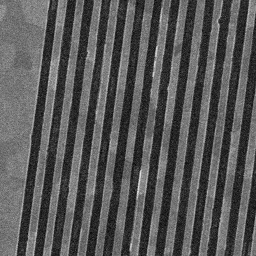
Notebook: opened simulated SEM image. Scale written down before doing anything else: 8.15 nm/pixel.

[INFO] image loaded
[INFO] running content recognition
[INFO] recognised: parallel lines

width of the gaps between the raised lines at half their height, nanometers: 78.8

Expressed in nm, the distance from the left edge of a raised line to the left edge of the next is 140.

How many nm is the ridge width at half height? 62.6